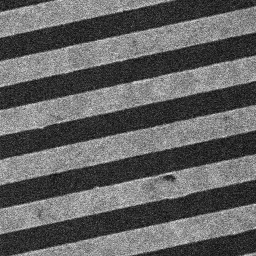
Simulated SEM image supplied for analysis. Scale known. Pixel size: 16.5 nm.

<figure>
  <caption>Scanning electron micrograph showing parallel lines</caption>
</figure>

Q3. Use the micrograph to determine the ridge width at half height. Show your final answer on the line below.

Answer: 401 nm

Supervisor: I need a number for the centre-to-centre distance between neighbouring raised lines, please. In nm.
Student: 787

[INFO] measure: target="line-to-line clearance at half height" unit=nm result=393